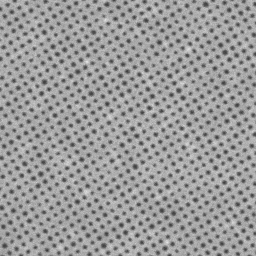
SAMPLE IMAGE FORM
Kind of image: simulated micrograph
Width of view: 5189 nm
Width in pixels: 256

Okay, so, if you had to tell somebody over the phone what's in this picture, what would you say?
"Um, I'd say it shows a regular array of holes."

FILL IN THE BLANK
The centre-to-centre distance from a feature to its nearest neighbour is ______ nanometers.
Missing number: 168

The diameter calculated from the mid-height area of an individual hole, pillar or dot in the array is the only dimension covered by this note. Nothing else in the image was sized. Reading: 99.7 nm